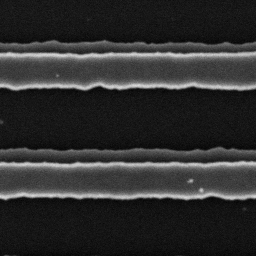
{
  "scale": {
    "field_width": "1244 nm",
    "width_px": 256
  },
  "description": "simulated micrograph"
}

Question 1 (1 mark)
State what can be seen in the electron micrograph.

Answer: lines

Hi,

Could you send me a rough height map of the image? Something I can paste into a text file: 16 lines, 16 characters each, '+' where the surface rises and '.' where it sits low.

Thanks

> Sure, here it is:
................
................
................
++++++++++++++++
++++++++++++++++
++..++.+..+..+++
................
................
................
................
++++++++++++++++
++++++++++++++++
................
................
................
................